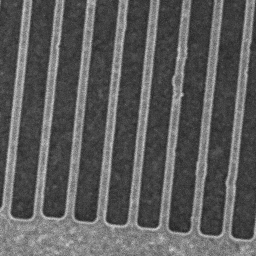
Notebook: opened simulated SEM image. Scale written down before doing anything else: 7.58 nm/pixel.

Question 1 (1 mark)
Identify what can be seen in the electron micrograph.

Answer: parallel lines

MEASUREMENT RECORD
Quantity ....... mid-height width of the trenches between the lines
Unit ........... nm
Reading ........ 186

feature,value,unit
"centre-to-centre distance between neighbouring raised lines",240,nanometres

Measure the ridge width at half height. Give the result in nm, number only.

53.7